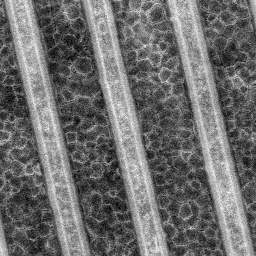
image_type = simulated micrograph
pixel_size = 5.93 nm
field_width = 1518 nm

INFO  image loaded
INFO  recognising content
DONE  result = one or a few lines or trenches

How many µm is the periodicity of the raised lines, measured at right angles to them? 0.473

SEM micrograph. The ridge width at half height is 118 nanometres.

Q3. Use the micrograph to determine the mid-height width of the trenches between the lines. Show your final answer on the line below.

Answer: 350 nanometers